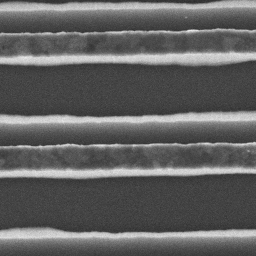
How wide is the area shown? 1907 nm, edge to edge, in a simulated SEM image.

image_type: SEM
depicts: lines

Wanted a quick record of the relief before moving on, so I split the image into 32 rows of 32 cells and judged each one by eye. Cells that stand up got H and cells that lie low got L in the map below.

LLLLLLLLLLLLLLLLLLLLLLLLLLLLLLLL
HHHHHHHHHHHHHHHHHHHHHHHHHHHHHHHH
HHHHHHHHHHHHHHHHHHHHHHHHHHHHHHHH
HHHHHHHHHHHHHHHHHHHHHHHHHHHHHHHH
HHHHHHHHHHHHHHHHHHHHHHHHHHHHHHHH
HHHHHHHHHHHHHHHHHHHHHHHHHHHHHHHH
HHHHHHHHHHHHHHHHHHHHHHHHHHHHHHHH
LLLLLLLLLLLLLLLLLLLLLLLLLLLLLLLL
LLLLLLLLLLLLLLLLLLLLLLLLLLLLLLLL
LLLLLLLLLLLLLLLLLLLLLLLLLLLLLLLL
LLLLLLLLLLLLLLLLLLLLLLLLLLLLLLLL
LLLLLLLLLLLLLLLLLLLLLLLLLLLLLLLL
LLLLLLLLLLLLLLLLLLLLLLLLLLLLLLLL
LLLLLLLLLLLLLLLLLLLLLLLLLLLLLLLL
LLLLLLLLLLLLLLLLLLLLLLLLLLLLLLLL
HHHHHHHHHHHHHHHHHHHHHHHHHHHHHHHH
HHHHHHHHHHHHHHHHHHHHHHHHHHHHHHHH
HHHHHHHHHHHHHHHHHHHHHHHHHHHHHHHH
HHHHHHHHHHHHHHHHHHHHHHHHHHHHHHHH
HHHHHHHHHHHHHHHHHHHHHHHHHHHHHHHH
HHHHHHHHHHHHHHHHHHHHHHHHHHHHHHHH
HHHHHHHHHHHHHHLLLLLLLLLLLLLLLLLL
LLLLLLLLLLLLLLLLLLLLLLLLLLLLLLLL
LLLLLLLLLLLLLLLLLLLLLLLLLLLLLLLL
LLLLLLLLLLLLLLLLLLLLLLLLLLLLLLLL
LLLLLLLLLLLLLLLLLLLLLLLLLLLLLLLL
LLLLLLLLLLLLLLLLLLLLLLLLLLLLLLLL
LLLLLLLLLLLLLLLLLLLLLLLLLLLLLLLL
LLLLLLLLLLLLLLLLLLLLLLLLLLLLLLLL
LHHHHHHHLLHHHLLHHHHHHHHHHHHHHHHH
HHHHHHHHHHHHHHHHHHHHHHHHHHHHHHHH
HHHHHHHHHHHHHHHHHHHHHHHHHHHHHHHH